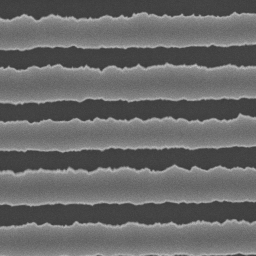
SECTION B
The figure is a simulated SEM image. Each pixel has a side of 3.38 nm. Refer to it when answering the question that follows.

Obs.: lines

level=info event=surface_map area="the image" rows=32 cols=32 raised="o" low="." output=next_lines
................................
................................
oooooooooooooooooooooooooooooooo
oooooooooooooooooooooooooooooooo
oooooooooooooooooooooooooooooooo
oooooooooooooooooooooooooooooooo
................................
................................
oo.ooooooooo.ooooooooooooooooooo
oooooooooooooooooooooooooooooooo
oooooooooooooooooooooooooooooooo
oooooooooooooooooooooooooooooooo
ooooooooooo..oooooo..oooo.......
................................
..............................o.
oooooooooooooooooooooooooooooooo
oooooooooooooooooooooooooooooooo
oooooooooooooooooooooooooooooooo
oooooooooooooooooooooooooooo....
................................
................................
oooooooooooooooooooooooooooooooo
oooooooooooooooooooooooooooooooo
oooooooooooooooooooooooooooooooo
oooooooooooooooooooooooooooooooo
ooooooo.o.oo.....o..............
................................
.............................o..
oooooooooooooooooooooooooooooooo
oooooooooooooooooooooooooooooooo
oooooooooooooooooooooooooooooooo
oooooooooooooooooooooooooooooooo